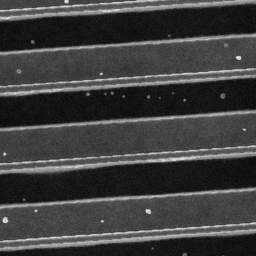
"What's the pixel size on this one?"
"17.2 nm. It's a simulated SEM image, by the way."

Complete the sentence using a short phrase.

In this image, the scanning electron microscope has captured lines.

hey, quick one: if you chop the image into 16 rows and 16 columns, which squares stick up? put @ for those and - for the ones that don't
@@@@@@@@@-------
----------------
------------@@@@
@@@@@@@@@@@@@@@@
@@@@@@@@@@@@@@@@
@@@@@-----------
----------------
---------@@@@@@@
@@@@@@@@@@@@@@@@
@@@@@@@@@@@@@@@@
@@@-------------
----------------
-------@@@@@@@@@
@@@@@@@@@@@@@@@@
@@@@@@@@@@@@@@--
----------------